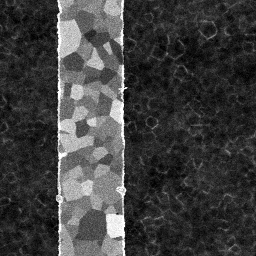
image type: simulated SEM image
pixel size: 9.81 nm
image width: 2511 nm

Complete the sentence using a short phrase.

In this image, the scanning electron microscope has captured one or a few lines or trenches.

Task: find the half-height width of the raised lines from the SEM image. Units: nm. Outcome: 640